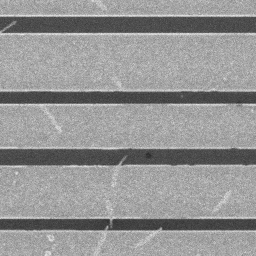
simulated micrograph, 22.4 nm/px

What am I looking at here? lines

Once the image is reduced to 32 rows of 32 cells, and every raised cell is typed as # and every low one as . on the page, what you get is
################################
################################
................................
................................
################################
################################
################################
################################
################################
################################
################################
................................
................................
################################
################################
################################
################################
################################
................................
................................
................................
################################
################################
################################
################################
################################
################################
................................
................................
################################
################################
################################